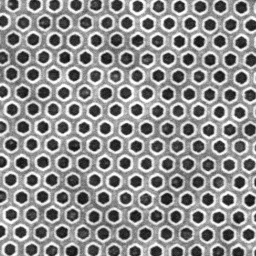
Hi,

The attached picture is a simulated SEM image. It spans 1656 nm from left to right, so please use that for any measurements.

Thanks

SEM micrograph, a regular array of holes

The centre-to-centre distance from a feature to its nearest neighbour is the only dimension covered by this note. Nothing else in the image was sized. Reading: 128 nanometers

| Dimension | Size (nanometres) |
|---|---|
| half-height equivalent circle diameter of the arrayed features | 87.6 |